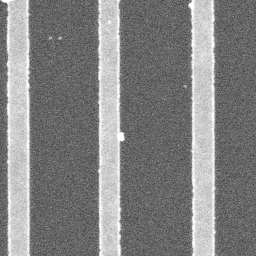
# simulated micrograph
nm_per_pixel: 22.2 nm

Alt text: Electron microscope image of lines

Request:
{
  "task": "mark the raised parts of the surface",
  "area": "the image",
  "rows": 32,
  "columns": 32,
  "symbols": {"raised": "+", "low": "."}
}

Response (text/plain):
.++.........+++.........+++.....
.+++........+++.........+++.....
.++.........+++.........+++.....
.++.........+++.........+++.....
.+++........+++.........+++.....
.+++........+++.........+++.....
.+++........+++.........+++.....
.+++........+++.........+++.....
.+++.........++.........+++.....
.+++........+++.........+++.....
.+++.........++.........+++.....
.+++........+++.........+++.....
.+++........+++.........+++.....
.+++.........++.........+++.....
.+++.........++.........+++.....
.+++.........++.........+++.....
.+++.........++.........+++.....
.+++.........++.........+++.....
.+++.........++.........+++.....
.+++.........++.........+++.....
.+++.........++.........+++.....
.+++........+++.........+++.....
.+++.........++.........+++.....
.+++.........++.........+++.....
.+++.........++.........+++.....
.+++.........++.........+++.....
.+++.........++.........+++.....
.+++.........++.........+++.....
.+++.........++.........+++.....
.+++.........++.........+++.....
.+++.........++.........+++.....
.+++.........++.........+++.....